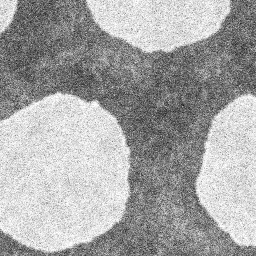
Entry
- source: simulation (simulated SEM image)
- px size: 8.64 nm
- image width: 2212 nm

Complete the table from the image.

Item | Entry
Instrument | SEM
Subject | raised bodies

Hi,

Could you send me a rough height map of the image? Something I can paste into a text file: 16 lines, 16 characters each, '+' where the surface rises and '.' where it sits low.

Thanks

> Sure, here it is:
+.....++++++++..
......++++++++..
........++++....
................
................
................
..++++........++
+++++++......+++
++++++++.....+++
++++++++.....+++
++++++++.....+++
++++++++....++++
++++++++.....+++
++++++++.....+++
++++++........++
..++............